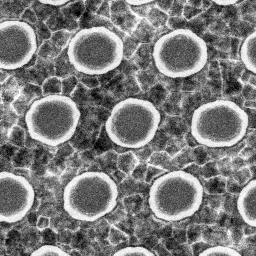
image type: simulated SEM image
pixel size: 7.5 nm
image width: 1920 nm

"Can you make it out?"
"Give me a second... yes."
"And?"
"raised bodies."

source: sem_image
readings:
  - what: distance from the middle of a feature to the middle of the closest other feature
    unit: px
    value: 80.7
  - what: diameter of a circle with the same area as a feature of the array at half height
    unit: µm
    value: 0.352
